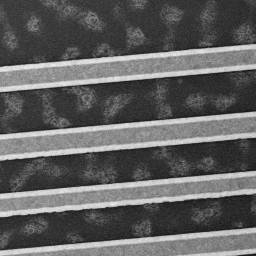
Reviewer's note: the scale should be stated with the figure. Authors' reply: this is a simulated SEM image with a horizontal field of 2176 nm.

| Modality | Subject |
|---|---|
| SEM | one or a few lines or trenches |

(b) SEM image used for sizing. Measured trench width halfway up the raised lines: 39.6 pixels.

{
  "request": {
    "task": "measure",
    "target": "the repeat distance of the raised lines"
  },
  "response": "530 nanometers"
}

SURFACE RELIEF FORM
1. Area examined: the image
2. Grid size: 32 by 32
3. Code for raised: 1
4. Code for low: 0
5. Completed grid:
00000000000000000000000000000000
00000000000000000000000000000000
00000000000000000000000000000000
00000000000000000000000000000000
00000000000000000000000000000000
00000000000000000000000000000000
00000000000000000000000011111111
00000000000001111111111111111111
00111111111111111111111111111100
11111111111111111110000000000000
11111111000000000000000000000000
00000000000000000000000000000000
00000000000000000000000000000000
00000000000000000000000000000000
00000000000000000000000000000111
00000000000000000011111111111111
00000001111111111111111111111111
11111111111111111111111110000000
11111111111110000000000000000000
11100000000000000000000000000000
00000000000000000000000000000000
00000000000000000000000000000000
00000000000000000000000111111111
00000000000011111111111111111111
01111111111111111111111110000000
11111111111111000000000000000000
11100000000000000000000000000000
00000000000000000000000000000000
00000000000000000000000000000000
00000000000000000000000011111111
00000000000001111111111111111111
00111111111111111111111111111100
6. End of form